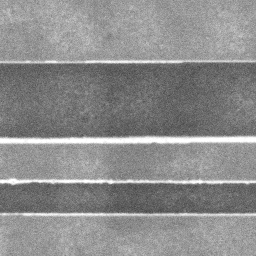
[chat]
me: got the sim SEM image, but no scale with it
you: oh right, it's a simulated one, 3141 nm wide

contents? lines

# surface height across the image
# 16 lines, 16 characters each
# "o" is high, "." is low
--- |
oooooooooooooooo
oooooooooooooooo
oooooooooooooooo
oooooooooooooooo
................
................
................
................
................
oooooooooooooooo
oooooooooooooooo
oooooooooooooooo
oooooooooooooooo
oooooooooooooooo
oooooooooooooooo
oooooooooooooooo